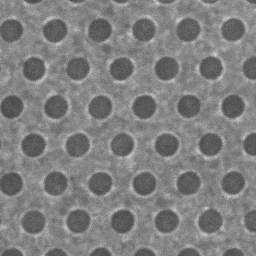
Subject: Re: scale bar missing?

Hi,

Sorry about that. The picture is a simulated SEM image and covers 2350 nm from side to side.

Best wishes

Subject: a regular array of holes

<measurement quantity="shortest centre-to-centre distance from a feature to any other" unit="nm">401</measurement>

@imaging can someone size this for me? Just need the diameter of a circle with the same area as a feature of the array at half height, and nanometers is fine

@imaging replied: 228